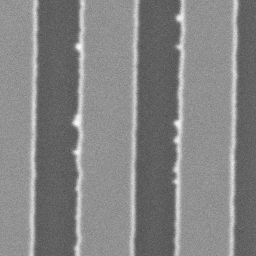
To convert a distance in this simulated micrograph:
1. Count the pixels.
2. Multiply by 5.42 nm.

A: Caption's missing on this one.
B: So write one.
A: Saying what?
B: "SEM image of lines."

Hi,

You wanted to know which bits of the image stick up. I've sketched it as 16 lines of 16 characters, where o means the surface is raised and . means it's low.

oo...oooo..oooo.
oo...oooo..oooo.
oo...oooo..oooo.
oo...oooo..oooo.
oo...ooo...oooo.
oo...ooo...oooo.
oo...ooo...oooo.
oo...ooo...oooo.
oo...ooo...oooo.
oo...ooo...oooo.
oo...ooo...oooo.
oo...ooo...oooo.
oo...ooo...oooo.
oo...ooo...oooo.
oo...ooo...oooo.
oo...ooo...oooo.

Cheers